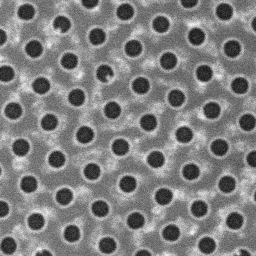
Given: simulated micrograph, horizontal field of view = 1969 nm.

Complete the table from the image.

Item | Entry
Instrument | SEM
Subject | a regular array of holes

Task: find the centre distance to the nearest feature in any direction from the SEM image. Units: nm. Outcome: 285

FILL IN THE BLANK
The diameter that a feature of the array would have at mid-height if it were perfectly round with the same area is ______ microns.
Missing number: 0.144